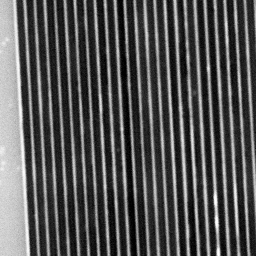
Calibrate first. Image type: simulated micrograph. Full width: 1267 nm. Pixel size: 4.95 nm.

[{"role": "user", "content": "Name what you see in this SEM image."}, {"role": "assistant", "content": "parallel lines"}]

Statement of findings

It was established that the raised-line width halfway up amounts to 8.6 nm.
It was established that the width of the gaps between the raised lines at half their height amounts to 40.1 nanometers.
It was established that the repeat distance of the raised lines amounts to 49.4 nm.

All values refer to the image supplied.